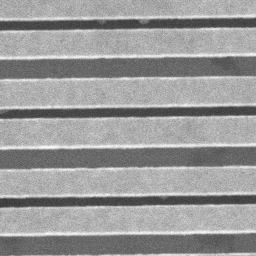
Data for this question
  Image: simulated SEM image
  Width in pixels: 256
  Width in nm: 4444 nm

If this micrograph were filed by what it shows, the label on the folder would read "lines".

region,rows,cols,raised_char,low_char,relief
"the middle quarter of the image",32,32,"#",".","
................................
................................
................................
..............##################
################################
################################
################################
################################
################################
################################
################################
................................
................................
.....................###########
################################
################################
################################
################################
################################
################################
################################
................................
................................
................................
................................
................................
################################
################################
################################
################################
################################
################################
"